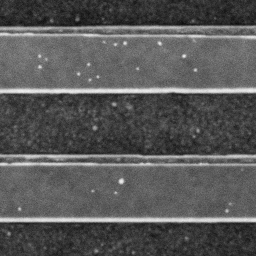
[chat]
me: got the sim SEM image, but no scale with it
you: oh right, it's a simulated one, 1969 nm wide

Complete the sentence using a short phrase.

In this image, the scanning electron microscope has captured lines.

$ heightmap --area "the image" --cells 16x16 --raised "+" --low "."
................
................
++++++++++++++++
++++++++++++++++
++++++++++++++++
++++++++++++++++
................
................
................
................
++++++++++++++++
++++++++++++++++
++++++++++++++++
++++++++++++++++
................
................